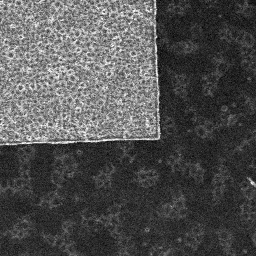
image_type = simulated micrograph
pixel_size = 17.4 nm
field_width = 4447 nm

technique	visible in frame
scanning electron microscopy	one or a few lines or trenches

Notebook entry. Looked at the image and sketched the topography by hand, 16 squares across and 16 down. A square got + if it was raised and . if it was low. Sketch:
++++++++++......
++++++++++......
++++++++++......
++++++++++......
++++++++++......
++++++++++......
++++++++++......
++++++++++......
++++++++++......
................
................
................
................
................
................
................